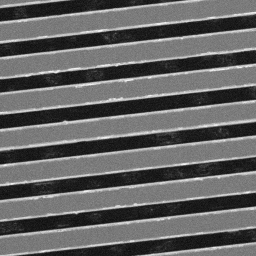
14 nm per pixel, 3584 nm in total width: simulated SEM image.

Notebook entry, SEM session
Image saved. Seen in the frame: parallel lines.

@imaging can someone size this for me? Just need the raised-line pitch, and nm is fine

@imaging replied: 496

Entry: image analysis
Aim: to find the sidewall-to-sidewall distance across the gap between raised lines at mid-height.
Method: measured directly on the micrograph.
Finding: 15.6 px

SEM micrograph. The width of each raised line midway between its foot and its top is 287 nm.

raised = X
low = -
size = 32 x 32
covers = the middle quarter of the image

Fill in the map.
XXXXXXXXXXX---------------------
XX------------------------------
---------------------------XXXXX
-------------------XXXXXXXXXXXXX
----------XXXXXXXXXXXXXXXXXXXXXX
-XXXXXXXXXXXXXXXXXXXXXXXXXXXXXXX
XXXXXXXXXXXXXXXXXXXXXXXXXXXXXXXX
XXXXXXXXXXXXXXXXXXXXXXXXXXXX----
XXXXXXXXXXXXXXXXXXX-------------
XXXXXXXXXX----------------------
X-------------------------------
-----------------------------XXX
--------------------XXXXXXXXXXXX
-----------XXXXXXXXXXXXXXXXXXXXX
--XXXXXXXXXXXXXXXXXXXXXXXXXXXXXX
XXXXXXXXXXXXXXXXXXXXXXXXXXXXXXXX
XXXXXXXXXXXXXXXXXXXXXXXXXXX-----
XXXXXXXXXXXXXXXXXX--------------
XXXXXXXXXXX---------------------
--------------------------------
----------------------------XXXX
-------------------XXXXXXXXXXXXX
----------XXXXXXXXXXXXXXXXXXXXXX
-XXXXXXXXXXXXXXXXXXXXXXXXXXXXXXX
XXXXXXXXXXXXXXXXXXXXXXXXXXXXXXXX
XXXXXXXXXXXXXXXXXXXXXXXXXX------
XXXXXXXXXXXXXXXXX---------------
XXXXXXXX------------------------
--------------------------------
--------------------------XXXXXX
------------------XXXXXXXXXXXXXX
---------XXXXXXXXXXXXXXXXXXXXXXX